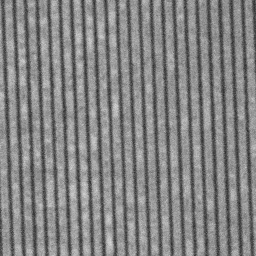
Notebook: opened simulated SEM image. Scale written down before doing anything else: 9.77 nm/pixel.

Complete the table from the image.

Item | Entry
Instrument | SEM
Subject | parallel lines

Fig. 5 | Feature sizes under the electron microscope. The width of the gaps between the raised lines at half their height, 0.0476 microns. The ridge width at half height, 64.7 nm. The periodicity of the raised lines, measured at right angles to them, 112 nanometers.